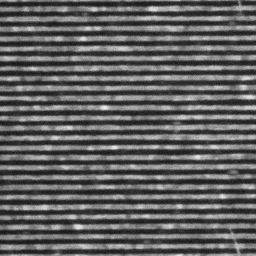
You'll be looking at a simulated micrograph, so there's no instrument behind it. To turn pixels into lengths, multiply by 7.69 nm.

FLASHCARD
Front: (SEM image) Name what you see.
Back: parallel lines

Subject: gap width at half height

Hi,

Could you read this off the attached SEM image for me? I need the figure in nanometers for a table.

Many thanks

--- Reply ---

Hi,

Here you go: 45.2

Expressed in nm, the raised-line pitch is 76.1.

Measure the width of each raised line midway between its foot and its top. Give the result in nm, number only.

29.8